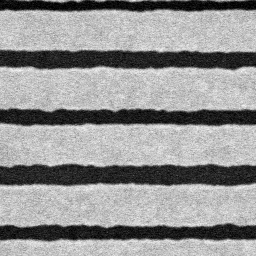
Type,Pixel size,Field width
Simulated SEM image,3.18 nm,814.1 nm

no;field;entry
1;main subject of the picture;lines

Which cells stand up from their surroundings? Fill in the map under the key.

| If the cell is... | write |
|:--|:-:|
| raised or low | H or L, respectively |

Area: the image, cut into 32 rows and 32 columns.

LLLLLLLLLLLLLLLLLLLLLLLLLLLLLLLL
HHHHHHHHHHHHHHHHHLHHHHHHHHHHHHHH
HHHHHHHHHHHHHHHHHHHHHHHHHHHHHHHH
HHHHHHHHHHHHHHHHHHHHHHHHHHHHHHHH
HHHHHHHHHHHHHHHHHHHHHHHHHHHHHHHH
HHHHHHHHHHHHHHHHHHHHHHHHHHHHHHHH
LLLLLLLLLLLLLLLLLLLLLLLLLHLLHLLL
LLLLLLLLLLLLLLLLLLLLLLLLLLLLLLLL
HLLLLLLLLLLLHLLLLLLLLLLLLLLLLLHH
HHHHHHHHHHHHHHHHHHHHHHHHHHHHHHHH
HHHHHHHHHHHHHHHHHHHHHHHHHHHHHHHH
HHHHHHHHHHHHHHHHHHHHHHHHHHHHHHHH
HHHHHHHHHHHHHHHHHHHHHHHHHHHHHHHH
HLHHHHHHHHHHHHHHHHHHHHHHHHHHHHHH
LLLLLLLLLLLLLLLLLLLLLLLLLLLLLLLL
LLLLLLLLLLLLLLLLLLLLLLLLLLLLLLLL
HHHHHHHHHHHHHHHHHHHHHHHHHHHHHHHH
HHHHHHHHHHHHHHHHHHHHHHHHHHHHHHHH
HHHHHHHHHHHHHHHHHHHHHHHHHHHHHHHH
HHHHHHHHHHHHHHHHHHHHHHHHHHHHHHHH
HHHHHHHHLLHHHHHHHHHHHHHHHHHHHHHH
LLLLLLLLLLLLLLLLLLLLLLLLLLLLLLLL
LLLLLLLLLLLLLLLLLLLLLLLLLLLLLLLL
HHHHHHHHHHHHHHHHHHHHHHHHHHHHHHHH
HHHHHHHHHHHHHHHHHHHHHHHHHHHHHHHH
HHHHHHHHHHHHHHHHHHHHHHHHHHHHHHHH
HHHHHHHHHHHHHHHHHHHHHHHHHHHHHHHH
HHHHHHHHHHHHHHHHHHHHHHHHHHHHHHHH
LLLLLLLLLLLLLLLLLLLLLLLLLLLLLLLL
LLLLLLLLLLLLLLLLLLLLLLLLLLLLLLLL
HHHHHHHHHHHHHHHHHHHHHHHHHHHHHHHH
HHHHHHHHHHHHHHHHHHHHHHHHHHHHHHHH